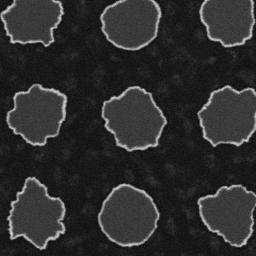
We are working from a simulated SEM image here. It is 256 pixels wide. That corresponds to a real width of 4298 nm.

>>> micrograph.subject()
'raised bodies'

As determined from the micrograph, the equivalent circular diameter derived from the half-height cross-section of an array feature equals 977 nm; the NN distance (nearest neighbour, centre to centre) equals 1580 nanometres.